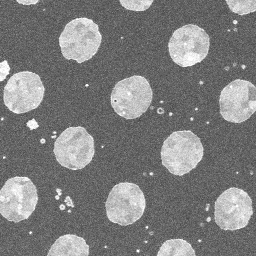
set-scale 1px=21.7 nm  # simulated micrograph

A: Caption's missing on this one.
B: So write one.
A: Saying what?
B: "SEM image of a regular array of raised bodies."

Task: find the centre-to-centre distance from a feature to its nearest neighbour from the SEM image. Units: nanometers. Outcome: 1640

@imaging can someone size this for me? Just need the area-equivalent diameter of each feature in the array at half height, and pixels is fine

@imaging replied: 40.7